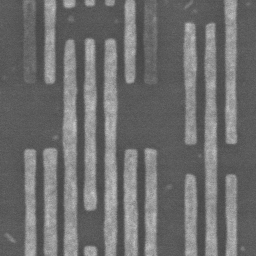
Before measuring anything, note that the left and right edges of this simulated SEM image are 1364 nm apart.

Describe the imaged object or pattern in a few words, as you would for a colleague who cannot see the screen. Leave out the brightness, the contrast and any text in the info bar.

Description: wiring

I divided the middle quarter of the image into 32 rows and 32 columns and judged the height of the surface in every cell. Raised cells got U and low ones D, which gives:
UUUDDUUUDDUUUDDUUUDDUUUDDDDDDDUU
UUUDDUUUDDUUUDDUUUDDUUUDDDDDDDUU
UUUDDUUUDDUUUDDUUUDDUUUDDDDDDDUU
UUUDDUUUDDUUUDDDUUDDUUUDDDDDDDUU
UUUDDUUUDDUUUDDDUDDDDUUDDDDDDDUU
UUUDDUUUDDUUUDDDDDDDDDDDDDDDDDUU
UUUDDUUUDDUUUDDDDDDDDDDDDDDDDDDU
UUUDDUUUDDUUUDDDDDDDDDDDDDDDDDDU
UUUDDUUUDDUUUDDDDDDDDDDDDDDDDDDU
UUUDDUUUDDUUUDDDDDDDDDDDDDDDDDDU
UUUDDUUUDDUUUDDDDDDDDDDDDDDDDDDU
UUUDDUUUDDUUUDDDDDDDDDDDDDDDDDDU
UUUDDUUUDDUUUDDDDDDDDDDDDDDDDDDU
UUUDDUUUDDUUUDDDDDDDDDDDDDDDDDDU
UUUDDUUUDDUUUDDDDDDDDDDDDDDDDDDU
UUUDDUUUDDUUUDDDDDDDDDDDDDDDDDDU
UUUDDUUUDDUUUDDDDDDDDDDDDDDDDDDU
UUUDDUUUDDUUUDDDDDDDDDDDDDDDDDDU
UUUDDUUUDDUUUDDDDDDDDDDDDDDDDDUU
UUUDDUUUDDDUUDDDDDDDDDDDDDDDDDUU
UUUDDUUUDDDUUDDDDDDDDDDDDDDDDDDD
UUUDDUUUDDDUUDDDUUDDUUUDDDDDDDDD
UUUDDUUUDDUUUDDUUUDDUUUDDDDDDDDD
UUUDDUUUDDUUUDDUUUDDUUUDDDDDDDDD
UUUDDUUUDDUUUDDUUUDDUUUDDDDDDDDD
UUUDDUUUDDUUUDDUUUDDDUUDDDDDDDDD
UUUDDUUUDDUUUDDUUUDDDUUDDDDDDDDD
UUUDDUUUDDUUUDDUUUDDDUUDDDDDDDDD
UUUDDUUUDDUUUDDUUUDDDUUDDDDDDDDU
UUUDDUUUDDUUUDDUUUDDDUUDDDDDDDDU
UUUDDUUUDDUUUDDUUUDDDUUDDDDDDDUU
UUUDDUUUDDUUUDDUUUDDDUUDDDDDDDUU